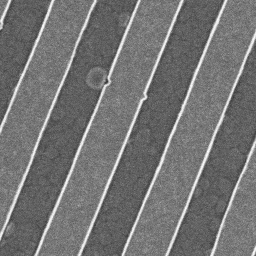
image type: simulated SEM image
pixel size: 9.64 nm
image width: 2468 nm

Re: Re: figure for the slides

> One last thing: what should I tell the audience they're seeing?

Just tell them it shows one or a few lines or trenches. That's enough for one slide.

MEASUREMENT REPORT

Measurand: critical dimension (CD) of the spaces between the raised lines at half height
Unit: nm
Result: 390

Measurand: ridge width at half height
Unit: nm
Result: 382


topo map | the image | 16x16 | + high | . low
...+++...++...++
...++...+++...++
..+++...++...+++
..+++..+++...++.
..++...+++..+++.
.+++..+++...+++.
.++...+++...++..
+++...++...+++..
+++..+++...++...
++...+++..+++...
++...++...+++..+
+...+++...++...+
+...++...+++..++
+..+++...++...++
...+++..+++...++
..+++...+++..+++